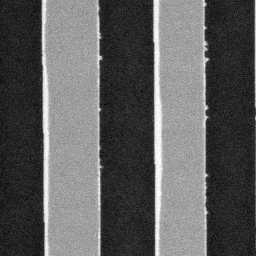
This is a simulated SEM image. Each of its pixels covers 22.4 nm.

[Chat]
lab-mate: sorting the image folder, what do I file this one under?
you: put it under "lines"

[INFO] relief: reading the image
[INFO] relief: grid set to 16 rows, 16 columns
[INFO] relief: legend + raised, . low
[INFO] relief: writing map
...+++....+++...
...+++....+++...
...+++....+++...
...+++....+++...
...+++....+++...
...+++....+++...
...+++....+++...
...+++....+++...
...+++....+++...
...+++....+++...
...+++....+++...
...+++....+++...
...+++....+++...
...+++....+++...
...+++....+++...
...+++....+++...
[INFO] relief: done